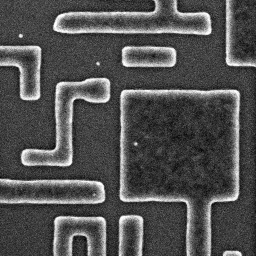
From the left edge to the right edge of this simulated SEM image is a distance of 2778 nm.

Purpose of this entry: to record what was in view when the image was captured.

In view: wiring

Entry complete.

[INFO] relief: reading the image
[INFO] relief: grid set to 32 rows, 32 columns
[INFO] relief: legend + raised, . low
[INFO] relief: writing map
....................++......++++
...................+++......++++
.......+++++++++++++++++++..++++
.......+++++++++++++++++++..++++
............................++++
............................++++
+++++..........+++++++......++++
+++++..........+++++++......++++
..+++...........................
...++...........................
...++..+++++++..................
...++..+++++++..++++++++++++++..
.......++..++..+++++++++++++++..
.......++......+++++++++++++++..
.......++......+++++++++++++++..
.......++......+++++++++++++++..
.......++......+++++++++++++++..
.......++......+++++++++++++++..
.......++......+++++++++++++++..
...++++++......+++++++++++++++..
...++.+++......+++++++++++++++..
...............+++++++++++++++..
+..............+++++++++++++++..
+++++++++++++..+++++++++++++++..
+++++++++++++..+++++++++++++++..
.......................+++......
........................++......
.......++++++..+++......++......
.......++++++..+++......++......
.......++..++..+++.....+++......
.......++..++..+++.....+++......
.......++..++..+++......++..++..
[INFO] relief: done